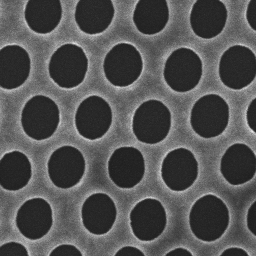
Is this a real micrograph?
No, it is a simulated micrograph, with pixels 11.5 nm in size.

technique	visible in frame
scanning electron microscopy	a regular array of holes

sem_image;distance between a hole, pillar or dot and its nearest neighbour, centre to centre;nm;611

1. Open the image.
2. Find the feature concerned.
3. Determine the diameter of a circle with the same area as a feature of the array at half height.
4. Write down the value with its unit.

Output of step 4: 465 nanometers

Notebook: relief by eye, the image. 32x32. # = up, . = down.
###.....##....###....###....###.
###.....#.....###....###....###.
###.....#.....###....###....###.
####...###...####...####....####
#########################..#####
########.######.################
...####....###...#####..####....
....##.....##.....###....###....
....##.....##.....###....##.....
....##.....##....####....##.....
...####...####..#####....###...#
######################.#########
####...###...######.#####...####
###....###....###....###.....##.
###....##.....###....###.....##.
###....##.....##.....###....###.
###....###...####....###....####
#################...############
#######..######..#####.######..#
...###....####....###...####....
....##.....###....##.....###....
....##.....###....##.....###....
....##....####....##....####...#
...##################..#########
###########...###########..#####
###...####....###...####....####
##....####.....#.....###.....##.
##.....###....##.....###.....##.
##....#####...##.....###....###.
###..############...####....####
#.##############################
...###....#####...###...####...#